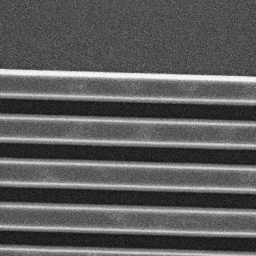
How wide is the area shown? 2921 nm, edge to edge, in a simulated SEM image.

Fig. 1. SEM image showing parallel lines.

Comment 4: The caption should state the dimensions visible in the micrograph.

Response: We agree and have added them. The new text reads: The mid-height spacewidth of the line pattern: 232 nm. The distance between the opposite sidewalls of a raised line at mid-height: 275 nm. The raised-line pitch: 0.504 microns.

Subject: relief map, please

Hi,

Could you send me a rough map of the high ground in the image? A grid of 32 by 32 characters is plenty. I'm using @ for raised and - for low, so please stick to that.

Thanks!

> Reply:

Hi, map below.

--------------------------------
--------------------------------
--------------------------------
--------------------------------
--------------------------------
--------------------------------
--------------------------------
--------------------------------
--------------------------------
@@@@@@@@@@@@@@@@@---------------
@@@@@@@@@@@@@@@@@@@@@@@@@@@@@@@@
@@@@@@@@@@@@@@@@@@@@@@@@@@@@@@@@
--------------------@@@@@@@@@@@@
--------------------------------
--------------------------------
@@@@@@@@@@@@@@@@@@@@@@@@@@@@@@@@
@@@@@@@@@@@@@@@@@@@@@@@@@@@@@@@@
@@@@@@@@@@@@@@@@@@@@@@@@@@@@@@@@
--------------------------------
--------------------------------
@@@@@@@@@@@@@@@@----------------
@@@@@@@@@@@@@@@@@@@@@@@@@@@@@@@@
@@@@@@@@@@@@@@@@@@@@@@@@@@@@@@@@
-------------------@@@@@@@@@@@@@
--------------------------------
--------------------------------
@@@@@@@@@@@@@@@@@@@@@@@@@@@@@@@-
@@@@@@@@@@@@@@@@@@@@@@@@@@@@@@@@
@@@@@@@@@@@@@@@@@@@@@@@@@@@@@@@@
--------------------------------
--------------------------------
@@@@@@@@@@@@@@@@@@@@------------